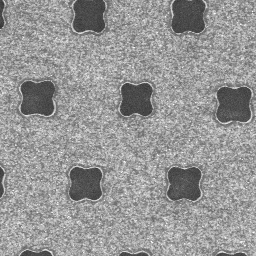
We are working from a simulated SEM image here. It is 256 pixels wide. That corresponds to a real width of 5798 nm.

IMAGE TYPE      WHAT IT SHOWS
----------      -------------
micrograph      holes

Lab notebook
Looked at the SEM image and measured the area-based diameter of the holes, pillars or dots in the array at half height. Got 825 nm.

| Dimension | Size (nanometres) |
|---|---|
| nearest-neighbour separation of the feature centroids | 2190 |